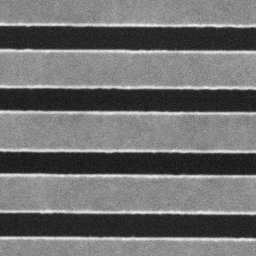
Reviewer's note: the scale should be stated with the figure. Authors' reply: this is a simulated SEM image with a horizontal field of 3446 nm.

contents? lines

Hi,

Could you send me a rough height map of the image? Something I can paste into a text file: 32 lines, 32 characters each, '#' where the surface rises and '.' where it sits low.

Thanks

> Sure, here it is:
################################
################################
################################
................................
................................
................................
################################
################################
################################
################################
################################
................................
................................
................................
################################
################################
################################
################################
################################
................................
................................
................................
################################
################################
################################
################################
################################
................................
................................
................................
################################
################################